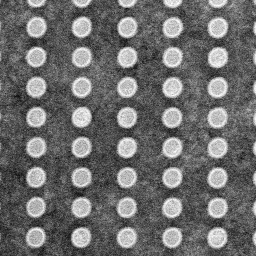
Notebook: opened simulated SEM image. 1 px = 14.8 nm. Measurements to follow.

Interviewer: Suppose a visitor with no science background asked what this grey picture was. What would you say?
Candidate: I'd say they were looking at a regular array of raised bodies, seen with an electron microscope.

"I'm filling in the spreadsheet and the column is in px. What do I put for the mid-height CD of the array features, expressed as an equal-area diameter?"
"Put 18.7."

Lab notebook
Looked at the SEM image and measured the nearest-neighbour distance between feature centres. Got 0.443 um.